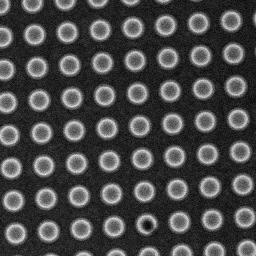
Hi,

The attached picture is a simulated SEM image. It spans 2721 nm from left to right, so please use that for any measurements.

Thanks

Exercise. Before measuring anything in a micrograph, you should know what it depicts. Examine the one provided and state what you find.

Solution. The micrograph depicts an array of small figures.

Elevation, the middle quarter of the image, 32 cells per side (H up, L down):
HHHHLLLHHHHHLLLHHHHHLLLLHHHHLLLL
HHHHLLLHHHHHLLLLHHHHLLLLLLLLLLLL
HHHLLLLLLHHLLLLLLLLLLLLLLLLLLLLL
LLLLLLLLLLLLLLLLLLLLLLLLLLLLLLLL
LLLLLLLLLLLLLLLLLLLLLLLLLHHHLLLL
LLLLLLLLLHHHLLLLHHHHHLLLHHHHHLLL
HHHHLLLLHHHHHLLLHHHHHLLLHHHHHLLL
HHHHHLLHHHHHHLLLHHHHHLLLHHHHHLLL
HHHHHLLHHHHHHLLLHHHHHLLLHHHHHLLL
HHHHHLLLHHHHHLLLHHHHLLLLLLHHLLLL
HHHHLLLLLHHHLLLLLLLLLLLLLLLLLLLL
LLLLLLLLLLLLLLLLLLLLLLLLLLLLLLLL
LLLLLLLLLLLLLLLLLLLLLLLLLLHHHLLL
LLLLLLLLLLHHLLLLLHHHHLLLLHHHHHLL
LHHHLLLLHHHHHLLLHHHHHHLLHHHHHHLL
HHHHHLLLHHHHHHLLHHHHHHLLHHHHHHLL
HHHHHLLLHHHHHHLLHHHHHHLLLHHHHHLL
HHHHHLLLHHHHHLLLLHHHHLLLLLHHHLLL
HHHHHLLLLHHHLLLLLLLLLLLLLLLLLLLL
LLLLLLLLLLLLLLLLLLLLLLLLLLLLLLLL
LLLLLLLLLLLLLLLLLLLLLLLLLLLHHLLL
LLLLLLLLLLLHLLLLLLHHHLLLLHHHHHLL
LLHHHLLLLHHHHHLLLHHHHHLLLHHHHHHL
LHHHHHLLLHHHHHLLLHHHHHLLLHHHHHHL
HHHHHHLLLHHHHHLLLHHHHHLLLHHHHHLL
HHHHHHLLLHHHHHLLLHHHHHLLLLHHHLLL
LHHHHHLLLHHHHLLLLLLHLLLLLLLLLLLL
LLHHLLLLLLLLLLLLLLLLLLLLLLLLLLLL
LLLLLLLLLLLLLLLLLLLLLLLLLLLLLLLL
LLLLLLLLLLLLLLLLLLLHHHLLLLHHHHHL
LLHHHLLLLLHHHHLLLLHHHHHLLLHHHHHL
LHHHHHLLLHHHHHHLLHHHHHHLLHHHHHHL